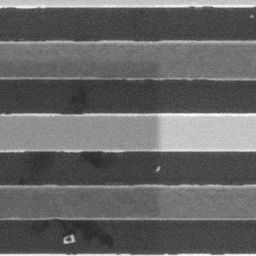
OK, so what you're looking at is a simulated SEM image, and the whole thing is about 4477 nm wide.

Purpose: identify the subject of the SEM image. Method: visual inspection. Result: lines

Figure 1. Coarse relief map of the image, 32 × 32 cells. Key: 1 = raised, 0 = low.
11111111111111111111111111111111
00000000000000000000000000000000
00000000000000000000000000000000
00000000000000000000000000000000
00000000000000000000000000000000
11111111111111111111111111111111
11111111111111111111111111111111
11111111111111111111111111111111
11111111111111111111111111111111
11111111111111111111111111111111
00000000000000000000000000000000
00000000000000000000000000000000
00000000000000000000000000000000
00000000000000000000000000000000
11111111111111111111111111111111
11111111111111111111111111111111
11111111111111111111111111111111
11111111111111111111111111111111
11111111111111111111111111111111
00000000000000000000000000000000
00000000000000000000000000000000
00000000000000000000000000000000
00000000000000000000000000000000
11111111111111111111111111111111
11111111111111111111111111111111
11111111111111111111111111111111
11111111111111111111111111111111
00000000000000000000000000000000
00000000000000000000000000000000
00000000000000000000000000000000
00000000000000000000000000000000
00000000000000000000000000000000